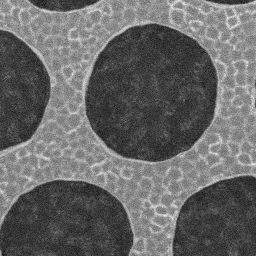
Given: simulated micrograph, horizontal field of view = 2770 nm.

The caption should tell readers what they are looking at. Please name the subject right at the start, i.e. holes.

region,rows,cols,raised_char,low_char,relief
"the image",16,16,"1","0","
1110011111111111
1111111110111111
0111111000001111
0011110000000111
0001110000000011
0001100000000011
0001100000000011
0001110000000111
0011110000000111
1111111000011111
1111111111111111
1110001111111000
1000000111110000
0000000011100000
0000000011100000
0000000011100000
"